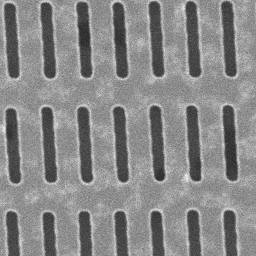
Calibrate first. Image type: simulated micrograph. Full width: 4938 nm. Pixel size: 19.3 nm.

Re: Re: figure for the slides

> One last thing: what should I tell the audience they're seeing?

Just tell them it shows a regular array of holes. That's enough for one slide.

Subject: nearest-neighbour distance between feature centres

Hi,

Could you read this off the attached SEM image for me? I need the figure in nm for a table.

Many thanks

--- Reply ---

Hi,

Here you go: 696